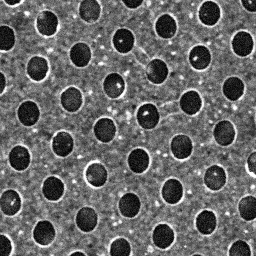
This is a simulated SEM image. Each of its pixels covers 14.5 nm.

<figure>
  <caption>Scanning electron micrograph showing a regular array of holes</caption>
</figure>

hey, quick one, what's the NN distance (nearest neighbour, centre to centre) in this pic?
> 0.652 microns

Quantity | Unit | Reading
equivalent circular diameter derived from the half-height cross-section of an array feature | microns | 0.352